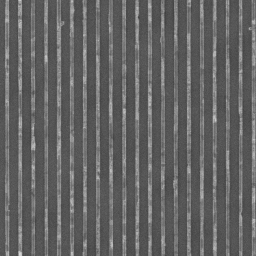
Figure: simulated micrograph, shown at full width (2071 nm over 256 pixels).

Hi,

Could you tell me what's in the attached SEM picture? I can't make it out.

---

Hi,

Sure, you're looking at parallel lines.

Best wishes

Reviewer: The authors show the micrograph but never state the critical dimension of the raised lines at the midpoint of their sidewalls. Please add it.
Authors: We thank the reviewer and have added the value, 26.3 nm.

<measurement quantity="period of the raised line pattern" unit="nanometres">105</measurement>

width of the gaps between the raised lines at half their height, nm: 79.9